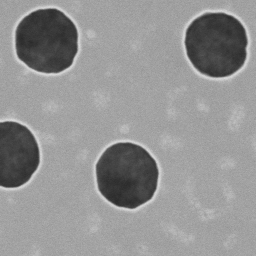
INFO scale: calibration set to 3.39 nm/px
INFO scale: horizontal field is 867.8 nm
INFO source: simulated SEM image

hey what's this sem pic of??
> holes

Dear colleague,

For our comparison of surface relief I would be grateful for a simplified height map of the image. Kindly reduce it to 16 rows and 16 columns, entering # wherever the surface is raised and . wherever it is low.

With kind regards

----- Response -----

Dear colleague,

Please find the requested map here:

################
#....#######...#
#....#######...#
#....#######...#
###.#########..#
################
################
################
..##############
..#####..#######
..####....######
.#####....######
#######..#######
################
################
################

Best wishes